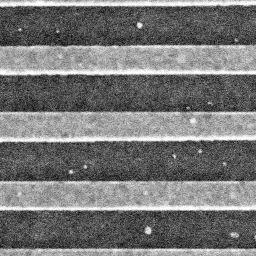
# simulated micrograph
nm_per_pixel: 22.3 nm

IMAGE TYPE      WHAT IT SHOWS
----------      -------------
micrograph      lines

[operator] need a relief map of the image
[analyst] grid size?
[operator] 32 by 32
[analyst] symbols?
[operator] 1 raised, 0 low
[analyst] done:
11111111111111111111111101000000
00000000000000000000000000000000
00000000000000000000000000000000
00000000000000000000000000000000
00000000000000000000000000000000
00000000000000000000000000000000
11111111111111111111111111111111
11111111111111111111111111111111
11111111111111111111111111111111
00000000000000000000000000000000
00000000000000000000000000000000
00000000000000000000000000000000
00000000000000000000000000000000
00000000000000000000000000000000
11111111111111111111111111111111
11111111111111111111111111111111
11111111111111111111111111111111
11111111110000000000000000000000
00000000000000000000000000000000
00000000000000000000000000000000
00000000000000000000000000000000
00000000000000000000000000000000
00000000000000000000000000000000
11111111111111111111111111111111
11111111111111111111111111111111
11111111111111111111111111111111
00000000000000000000000000000000
00000000000000000000000000000000
00000000000000000000000000000000
00000000000000000000000000000000
00000000000000000000000000000000
11111111111111111111111111111111